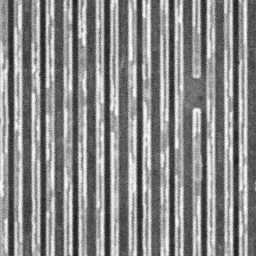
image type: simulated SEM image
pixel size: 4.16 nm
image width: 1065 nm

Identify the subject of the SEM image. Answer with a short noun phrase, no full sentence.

parallel lines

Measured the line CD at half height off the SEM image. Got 31.8 nm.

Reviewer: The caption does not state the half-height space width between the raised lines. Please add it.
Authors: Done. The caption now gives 28.1 nanometres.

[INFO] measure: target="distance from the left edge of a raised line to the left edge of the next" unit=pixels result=16